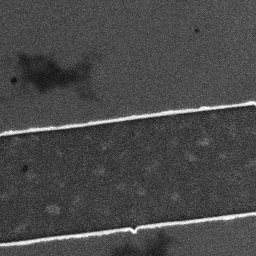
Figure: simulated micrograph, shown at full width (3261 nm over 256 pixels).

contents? one or a few lines or trenches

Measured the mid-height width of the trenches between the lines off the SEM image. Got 1390 nm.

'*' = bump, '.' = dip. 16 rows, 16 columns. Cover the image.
****************
****************
****************
****************
****************
****************
****************
********........
................
................
................
................
................
...............*
.......*********
****************